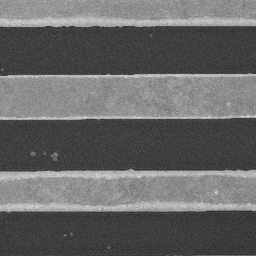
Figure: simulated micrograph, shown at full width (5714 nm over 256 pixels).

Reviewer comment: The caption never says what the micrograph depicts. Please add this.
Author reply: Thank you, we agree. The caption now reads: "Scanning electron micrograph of lines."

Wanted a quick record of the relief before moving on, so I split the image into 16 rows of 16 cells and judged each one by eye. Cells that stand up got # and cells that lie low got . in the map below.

################
################
................
................
................
################
################
................
................
................
................
################
################
................
................
................